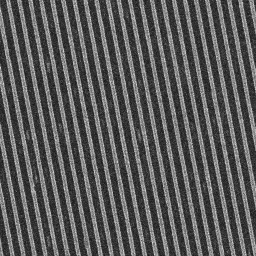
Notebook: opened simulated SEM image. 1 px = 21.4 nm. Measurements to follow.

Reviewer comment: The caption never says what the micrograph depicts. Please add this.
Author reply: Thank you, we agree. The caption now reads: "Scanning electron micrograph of parallel lines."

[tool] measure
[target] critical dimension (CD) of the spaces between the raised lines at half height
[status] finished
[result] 155 nanometres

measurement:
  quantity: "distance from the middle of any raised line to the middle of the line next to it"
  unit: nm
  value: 232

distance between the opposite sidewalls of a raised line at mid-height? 0.0761 micrometres